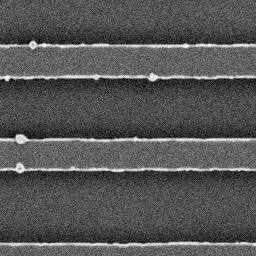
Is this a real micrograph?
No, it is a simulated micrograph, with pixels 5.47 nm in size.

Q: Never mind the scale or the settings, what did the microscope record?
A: lines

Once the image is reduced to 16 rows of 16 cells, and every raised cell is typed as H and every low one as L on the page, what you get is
LLLLLLLLLLLLLLLL
LLLLLLLLLLLLLLLL
LLLLLLLLLLLLLLLL
HHHHHHHHHHHHHHHH
HHHHHHHHHHHHHHHH
LLLLLLLLLLLLLLLL
LLLLLLLLLLLLLLLL
LLLLLLLLLLLLLLLL
LLLLLLLLLLLLLLLL
HHHHHHHHHHHHHHHH
HHHHHHHHHHHHHHHH
LLLLLLLLLLLLLLLL
LLLLLLLLLLLLLLLL
LLLLLLLLLLLLLLLL
LLLLLLLLLLLLLLLL
HHHHHHHHHHHHHHHH